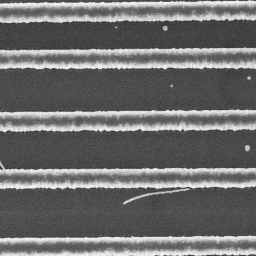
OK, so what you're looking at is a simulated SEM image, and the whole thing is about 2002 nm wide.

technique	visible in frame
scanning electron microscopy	lines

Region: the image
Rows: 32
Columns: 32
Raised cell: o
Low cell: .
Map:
.....o.o.ooooooooooooooooooooooo
oooooooooooooooooooooooooooooooo
ooooooooooooooo.................
................................
................................
................................
oooooooooooooooooooooooooooooooo
oooooooooooooooooooooooooooooooo
................................
................................
................................
................................
................................
................................
oooooooooooooooooooooooooooooooo
oooooooooooooooooooooooooooooooo
................................
................................
................................
................................
................................
oooooooooooooooooooooooooooooooo
oooooooooooooooooooooooooooooooo
................................
................................
................................
................................
................................
................................
................................
oooooooooooooooooooooooooooooooo
oooooooooooooooooooooooooooooooo